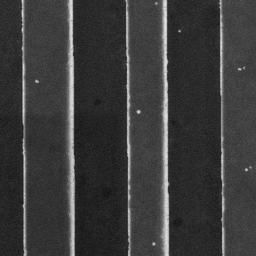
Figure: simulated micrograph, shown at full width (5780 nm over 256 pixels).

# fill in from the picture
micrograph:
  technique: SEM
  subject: lines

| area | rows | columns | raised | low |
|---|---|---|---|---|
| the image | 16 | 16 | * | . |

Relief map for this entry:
.****...**....**
.****...**....**
.****...**....**
.****...**....**
.****...**....**
.****...**....**
.****...**....**
.****...**....**
..***...**....**
..***...**....**
..***...**....**
..***...**....**
..***...**....**
..***...**....**
..***...**....**
..***...***...**